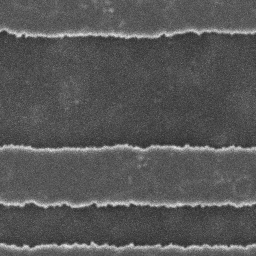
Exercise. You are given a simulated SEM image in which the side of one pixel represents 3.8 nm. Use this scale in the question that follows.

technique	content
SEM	one or a few lines or trenches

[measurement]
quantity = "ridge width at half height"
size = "220 nm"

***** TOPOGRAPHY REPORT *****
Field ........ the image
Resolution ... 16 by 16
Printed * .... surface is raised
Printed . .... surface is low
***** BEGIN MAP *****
****************
****************
................
................
................
................
................
................
................
****************
****************
****************
****************
................
................
****************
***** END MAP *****